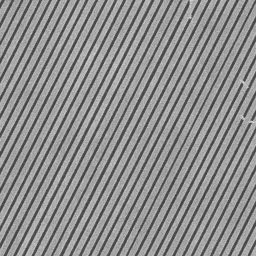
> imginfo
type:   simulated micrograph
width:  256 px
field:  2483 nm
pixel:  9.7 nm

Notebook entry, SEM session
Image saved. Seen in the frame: parallel lines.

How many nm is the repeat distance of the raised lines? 81.1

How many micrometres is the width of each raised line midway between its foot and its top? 0.0552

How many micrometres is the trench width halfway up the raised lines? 0.0282